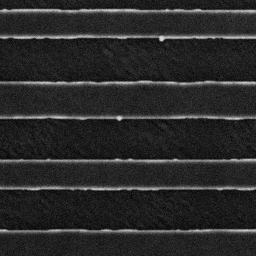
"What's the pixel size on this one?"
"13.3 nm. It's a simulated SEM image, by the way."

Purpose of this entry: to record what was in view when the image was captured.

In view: lines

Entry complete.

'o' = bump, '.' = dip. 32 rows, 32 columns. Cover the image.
................................
oooooooooooooooooooooooooooooooo
oooooooooooooooooooooooooooooooo
oooooooooooooooooooooooooooooooo
oooooooooooooooooooooooooooooooo
................................
................................
................................
................................
................................
oooooooooooooooooooooooooooooooo
oooooooooooooooooooooooooooooooo
oooooooooooooooooooooooooooooooo
oooooooooooooooooooooooooooooooo
oooooooooooooooooooooooooooooooo
................................
................................
................................
................................
................................
oooooooooooooooooooooooooooooooo
oooooooooooooooooooooooooooooooo
oooooooooooooooooooooooooooooooo
oooooooooooooooooooooooooooooooo
................................
................................
................................
................................
................................
oooooooooooooooooooooooooooooooo
oooooooooooooooooooooooooooooooo
oooooooooooooooooooooooooooooooo